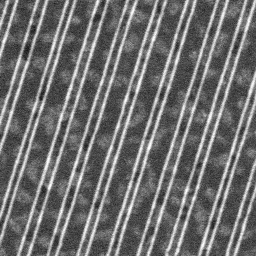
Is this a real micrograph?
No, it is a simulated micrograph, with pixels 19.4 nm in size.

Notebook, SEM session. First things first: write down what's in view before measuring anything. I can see parallel lines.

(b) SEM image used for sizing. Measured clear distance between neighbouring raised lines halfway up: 385 nm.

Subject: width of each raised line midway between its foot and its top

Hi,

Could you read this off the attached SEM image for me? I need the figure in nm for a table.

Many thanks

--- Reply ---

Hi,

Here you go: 164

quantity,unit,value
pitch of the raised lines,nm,555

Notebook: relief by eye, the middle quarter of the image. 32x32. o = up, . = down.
...ooo.....oo.....oo......oo....
...oo.....ooo.....oo.....ooo....
...oo.....ooo....ooo.....oo.....
..ooo.....oo.....oo......oo.....
..ooo....ooo.....oo......oo.....
..oo.....oo......oo.....oo......
.ooo.....oo.....oo......oo.....o
.ooo....ooo.....oo......oo.....o
.oo.....oo......oo.....oo......o
ooo.....oo.....ooo.....oo.....oo
ooo....ooo.....oo......oo.....oo
ooo....oo......oo.....oo......oo
oo.....oo.....ooo.....oo.....ooo
oo....ooo.....oo......oo.....ooo
o.....ooo.....oo.....oo......oo.
o.....oo.....ooo.....oo......oo.
o.....oo.....oo......oo.....ooo.
o....ooo.....oo.....oo......oo..
.....oo.....oo......oo......oo..
.....oo.....oo......oo.....ooo..
....ooo.....oo.....oo......oo...
....oo......oo.....oo......oo...
....oo.....oo......oo.....ooo...
...ooo.....oo......oo.....ooo...
...oo......oo.....oo......oo....
...oo.....oo......oo.....ooo....
..ooo.....oo......oo.....ooo....
..oo......oo.....oo......oo.....
..oo.....ooo.....oo.....ooo.....
.ooo.....oo......oo.....ooo....o
.ooo.....oo.....oo......ooo....o
.oo.....ooo.....oo......oo.....o